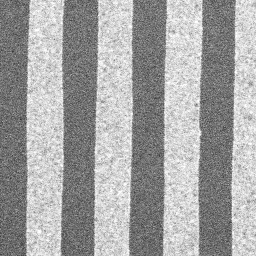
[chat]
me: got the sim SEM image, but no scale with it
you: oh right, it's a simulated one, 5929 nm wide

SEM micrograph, one or a few lines or trenches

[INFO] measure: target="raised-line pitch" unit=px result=68.7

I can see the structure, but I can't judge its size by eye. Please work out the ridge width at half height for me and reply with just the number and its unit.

790 nm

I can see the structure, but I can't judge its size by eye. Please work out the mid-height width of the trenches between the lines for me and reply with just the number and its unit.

802 nm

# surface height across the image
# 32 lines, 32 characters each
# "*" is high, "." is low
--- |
....****....****.....****.....**
....****....****.....****.....**
....****....****.....****.....**
....****....****.....****.....**
....****....****.....****.....**
....****....****.....****....***
....****....****.....****....***
....****....****.....****....***
....****....****.....****.....**
....****....****.....****....***
....****....****.....****....***
....****....****.....****....***
...*****....****.....****....***
...*****....****.....****....***
...*****....****.....****....***
...*****....****.....****....***
...*****....****.....****....***
...*****....****.....****....***
...*****....****.....****....***
....****....****.....****....***
....****....****.....****....***
....****....****.....****....***
....****....****.....****....***
....****....****.....****....***
...*****....****.....****....***
...*****....****.....****....***
...*****....****.....****....***
...*****....****.....****....***
...*****....****.....****....***
...****.....****.....****....***
...*****....****.....****....***
...****.....****.....****....***